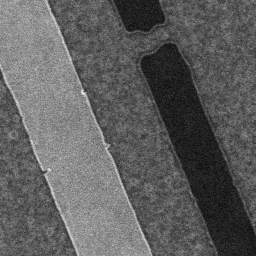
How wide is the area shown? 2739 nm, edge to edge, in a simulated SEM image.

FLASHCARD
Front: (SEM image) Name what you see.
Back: one or a few lines or trenches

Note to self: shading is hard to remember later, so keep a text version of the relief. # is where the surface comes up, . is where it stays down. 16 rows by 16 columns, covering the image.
###....###......
####....##......
####............
####.....##.....
#####....###....
.####....###....
.#####....###...
.#####....###...
..####....###...
..#####....###..
...####....###..
...#####....###.
...#####....###.
....####.....###
....#####....###
.....####....###